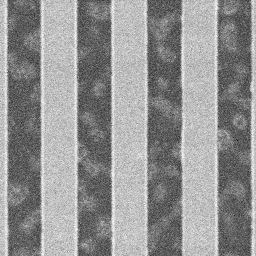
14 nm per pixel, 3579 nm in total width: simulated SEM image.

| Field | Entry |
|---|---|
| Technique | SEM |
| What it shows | one or a few lines or trenches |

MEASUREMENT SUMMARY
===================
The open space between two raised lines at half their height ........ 513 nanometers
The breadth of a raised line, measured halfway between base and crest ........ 463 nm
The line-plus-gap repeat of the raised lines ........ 983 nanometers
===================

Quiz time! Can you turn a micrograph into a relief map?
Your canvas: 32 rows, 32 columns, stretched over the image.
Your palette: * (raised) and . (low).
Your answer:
*....****.....****.....****.....
*....****.....****.....****.....
*....****.....****.....****.....
*....****.....****.....****.....
*....****.....****.....****.....
*....****.....****.....****.....
*....****.....****.....****.....
*....****.....****.....****.....
*....****.....****.....****.....
*....****.....****.....****.....
*....****.....****.....****.....
*....****.....****.....****.....
*....****.....****.....****.....
*....****.....****.....****.....
*....****.....****.....****.....
*....****.....****.....****.....
*....****.....****.....****.....
*....****.....****.....****.....
*....****.....****.....****.....
*....****.....****.....****.....
*....****.....****.....****.....
*....****.....****.....****.....
*....****.....****.....****.....
*....****.....****.....****.....
*....****.....****.....****.....
*....****.....****.....****.....
*....****.....****.....****.....
*....****.....****.....****.....
*....****.....****.....****.....
*....****.....****.....****.....
*....****.....****.....****.....
*....****.....****.....****.....